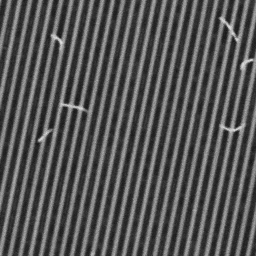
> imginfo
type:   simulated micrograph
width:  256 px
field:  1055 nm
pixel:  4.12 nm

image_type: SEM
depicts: parallel lines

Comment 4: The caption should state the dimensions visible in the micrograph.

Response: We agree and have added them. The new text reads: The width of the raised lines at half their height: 15.1 nanometers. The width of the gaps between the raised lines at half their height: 0.0263 micrometres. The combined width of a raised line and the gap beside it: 0.0418 µm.